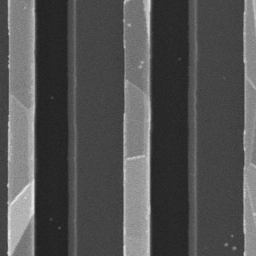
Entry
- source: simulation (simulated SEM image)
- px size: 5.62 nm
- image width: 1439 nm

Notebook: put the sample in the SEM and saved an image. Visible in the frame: lines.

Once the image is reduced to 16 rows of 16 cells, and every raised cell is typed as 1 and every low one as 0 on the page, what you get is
1100011110001111
1100011110001111
1100011110001111
1100011110001111
1100011110001111
1100011110001111
1100011110001111
1100011110001111
1100011110001111
1100011110001111
1100011110001111
1100011110001111
1100011110001111
1100011110001111
1100011110001111
1100011110001111